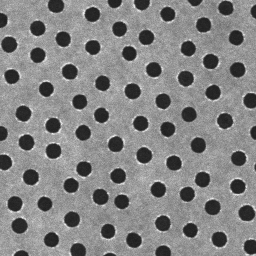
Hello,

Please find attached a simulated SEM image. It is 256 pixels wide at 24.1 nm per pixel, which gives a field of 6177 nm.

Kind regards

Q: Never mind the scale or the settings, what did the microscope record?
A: a regular array of holes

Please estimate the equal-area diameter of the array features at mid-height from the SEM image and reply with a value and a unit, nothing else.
384 nm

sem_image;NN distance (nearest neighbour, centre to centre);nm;678